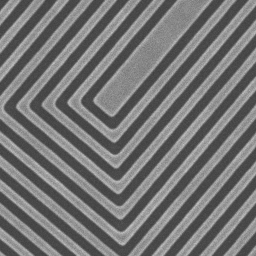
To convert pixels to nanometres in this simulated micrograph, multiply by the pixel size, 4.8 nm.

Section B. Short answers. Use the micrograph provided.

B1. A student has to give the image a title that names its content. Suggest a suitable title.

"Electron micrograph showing groups of lines, slits or small figures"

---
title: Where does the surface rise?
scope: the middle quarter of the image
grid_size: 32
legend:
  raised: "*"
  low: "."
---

..***...***...*********...***...
.***...***...*********...***...*
.***...***...*********..***...**
***...***...*********...***...**
**...***...*********...***...***
*...***...*********...***...***.
...***...*********...***...***..
..***...*********...***...***...
..***...********...***...***...*
.***...*********...***...**....*
.****...*******...***...***...**
..****....****...***...***...***
....***....**...***...***...***.
*....***.......***...***...***..
***...****....***...***...***...
****...****...***..****..***...*
.****...********...***...***...*
..****....*****...***...***...**
....***....***...***...***...***
*....***........***...***...***.
***...****.....***...***...***..
****...****...***...***...***...
.****...****.****...***...***..*
...***....******...***...***...*
....***....****...***...***...**
*....***....**...***...***...***
***...****......***...***...***.
****...****....***...***...***..
.****...****..***....***..***...
...***....*******...***...***...
....***....*****...***...***...*
*....***....***...***...***...**